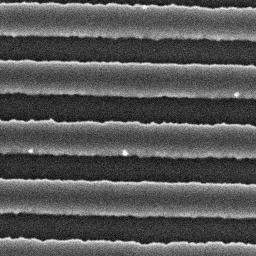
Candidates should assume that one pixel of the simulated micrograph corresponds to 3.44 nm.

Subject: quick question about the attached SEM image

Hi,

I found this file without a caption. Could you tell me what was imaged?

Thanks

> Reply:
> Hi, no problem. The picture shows lines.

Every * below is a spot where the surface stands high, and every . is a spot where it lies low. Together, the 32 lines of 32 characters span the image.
*******.***...*.................
********************************
********************************
********************************
..............*..***************
................................
................................
................................
********************************
********************************
********************************
**.*****************************
................................
................................
................................
************************...*....
********************************
********************************
********************************
....................************
................................
................................
***.**..........................
********************************
********************************
********************************
....****************************
................................
................................
................................
*****************..*.*******.**.
********************************